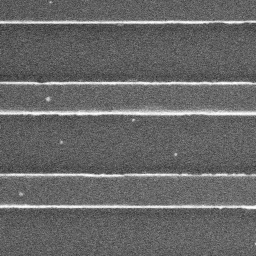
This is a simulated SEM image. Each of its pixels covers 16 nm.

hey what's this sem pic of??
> lines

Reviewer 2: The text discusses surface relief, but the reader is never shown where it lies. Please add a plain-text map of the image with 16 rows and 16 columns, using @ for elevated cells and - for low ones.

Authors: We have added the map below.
@@@@@@@@@@@@@@@@
----------------
----------------
----------------
----------------
@@@@@@@@@@@@@@@@
@@@@@@@@@@@@@@@@
----------------
----------------
----------------
----------------
@@@@@@@@@@@@@@@@
@@@@@@@@@@@@@@@@
----------------
----------------
----------------